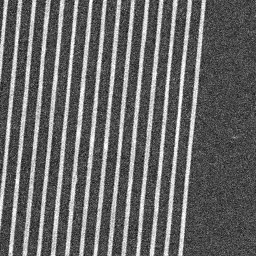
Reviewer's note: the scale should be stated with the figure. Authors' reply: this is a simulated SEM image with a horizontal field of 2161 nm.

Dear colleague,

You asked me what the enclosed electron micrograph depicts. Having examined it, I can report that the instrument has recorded parallel lines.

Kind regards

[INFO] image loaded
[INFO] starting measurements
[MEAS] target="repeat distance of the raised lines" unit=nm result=119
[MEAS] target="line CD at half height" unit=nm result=27.3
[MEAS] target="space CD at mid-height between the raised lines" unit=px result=11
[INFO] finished